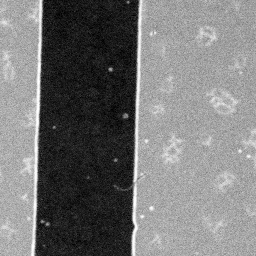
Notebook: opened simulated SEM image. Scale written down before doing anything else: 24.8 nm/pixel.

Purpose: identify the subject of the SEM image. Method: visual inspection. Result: one or a few lines or trenches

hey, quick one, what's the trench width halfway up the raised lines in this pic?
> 2470 nm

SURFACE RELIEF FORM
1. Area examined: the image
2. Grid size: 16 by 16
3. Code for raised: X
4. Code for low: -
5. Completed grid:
XXX------XXXXXXX
XXX------XXXXXXX
XX-------XXXXXXX
XX-------XXXXXXX
XX-------XXXXXXX
XX-------XXXXXXX
XX-------XXXXXXX
XX-------XXXXXXX
XX-------XXXXXXX
XX-------XXXXXXX
XX-------XXXXXXX
XX------XXXXXXXX
XX------XXXXXXXX
XX------XXXXXXXX
XX------XXXXXXXX
XX------XXXXXXXX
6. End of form